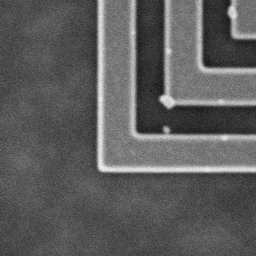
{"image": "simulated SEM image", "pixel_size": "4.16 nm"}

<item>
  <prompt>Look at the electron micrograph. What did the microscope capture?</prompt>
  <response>groups of lines, slits or small figures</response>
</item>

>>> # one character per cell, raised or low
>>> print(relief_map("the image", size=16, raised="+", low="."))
......++..+++.++
......++..+++.++
......++..+++...
......++..+++...
......++..++++++
......++..++++++
......++..+.....
......++........
......+++.....+.
......++++++++++
.......+++++++++
................
................
................
................
................